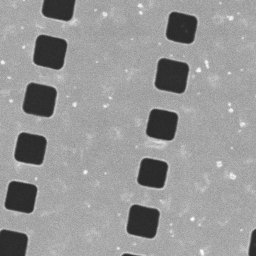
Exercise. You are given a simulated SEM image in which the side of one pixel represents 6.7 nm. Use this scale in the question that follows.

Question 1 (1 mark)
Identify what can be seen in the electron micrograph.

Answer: a regular array of holes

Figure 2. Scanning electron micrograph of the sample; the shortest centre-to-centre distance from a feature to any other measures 329 nanometers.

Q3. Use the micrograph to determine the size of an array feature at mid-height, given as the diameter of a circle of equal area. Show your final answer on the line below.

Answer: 0.22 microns